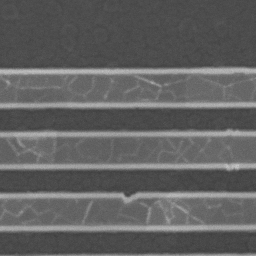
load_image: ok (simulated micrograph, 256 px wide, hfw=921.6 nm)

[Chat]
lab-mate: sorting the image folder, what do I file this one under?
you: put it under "one or a few lines or trenches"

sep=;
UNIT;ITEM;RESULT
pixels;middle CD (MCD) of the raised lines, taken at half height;33.5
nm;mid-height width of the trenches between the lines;100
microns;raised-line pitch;0.222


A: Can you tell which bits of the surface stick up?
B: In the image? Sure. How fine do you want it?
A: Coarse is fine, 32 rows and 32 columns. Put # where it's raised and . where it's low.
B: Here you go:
................................
................................
................................
................................
................................
................................
................................
................................
................................
################################
################################
################################
################################
................................
................................
................................
................................
################################
################################
################################
################################
................................
................................
................................
...######.#####..###############
################################
################################
################################
#######..#####.###########......
................................
................................
................................